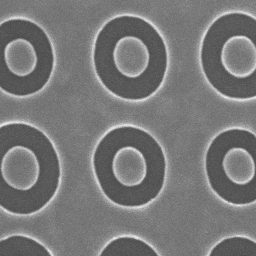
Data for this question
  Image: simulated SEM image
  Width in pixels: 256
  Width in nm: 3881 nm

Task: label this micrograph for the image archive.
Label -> ring-shaped grooves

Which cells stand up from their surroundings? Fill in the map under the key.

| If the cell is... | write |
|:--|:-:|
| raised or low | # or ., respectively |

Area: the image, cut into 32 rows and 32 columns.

################################
################################
#..###########....#########.....
.....########......#######......
......######........######......
.###..######...###...####...####
.###...#####..####...####...####
.####..#####..####...####...####
.###...#####...###...####...####
......######....#....#####......
......#######.......######......
#....#########.....########.....
################..##############
################################
################################
#..#############################
.....#########....##########...#
......#######......########.....
..#....#####........######......
.###...#####..####...#####..###.
#####..#####..####...#####..####
#####...####..####...#####..####
.###...#####...###...#####...##.
..##...######.......######......
.......######.......#######.....
......#########...###########..#
#...############################
################################
################################
##.#############################
.....#########....#########.....
......#######......#######......